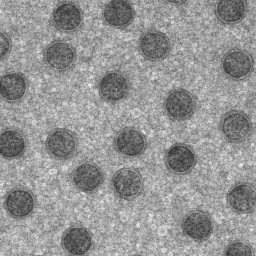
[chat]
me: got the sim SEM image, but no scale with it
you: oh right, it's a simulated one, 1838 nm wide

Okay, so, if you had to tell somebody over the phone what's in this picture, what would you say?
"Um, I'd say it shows a regular array of raised bodies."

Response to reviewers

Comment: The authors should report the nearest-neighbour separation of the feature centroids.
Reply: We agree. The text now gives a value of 384 nm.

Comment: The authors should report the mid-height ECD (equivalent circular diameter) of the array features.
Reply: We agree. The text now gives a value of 203 nm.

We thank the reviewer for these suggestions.